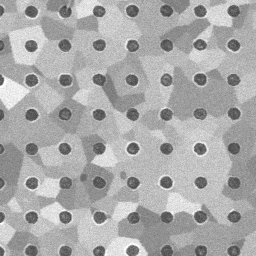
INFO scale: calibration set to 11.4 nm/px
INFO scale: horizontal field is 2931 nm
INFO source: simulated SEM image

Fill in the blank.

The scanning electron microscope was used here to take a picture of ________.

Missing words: a regular array of holes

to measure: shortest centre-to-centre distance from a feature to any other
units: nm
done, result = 383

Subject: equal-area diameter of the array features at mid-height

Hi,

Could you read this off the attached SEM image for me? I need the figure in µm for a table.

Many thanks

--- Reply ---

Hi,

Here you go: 0.15